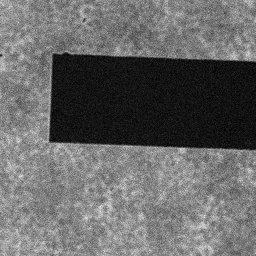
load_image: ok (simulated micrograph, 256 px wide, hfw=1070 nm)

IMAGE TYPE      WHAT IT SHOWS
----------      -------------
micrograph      one or a few lines or trenches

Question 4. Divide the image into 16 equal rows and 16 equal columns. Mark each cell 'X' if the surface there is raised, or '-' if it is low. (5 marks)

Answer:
XXXXXXXXXXXXXXXX
XXXXXXXXXXXXXXXX
XXXXXXXXXXXXXXXX
XXX-----XXXXXXXX
XXX-------------
XXX-------------
XXX-------------
XXX-------------
XXX-------------
XXXXXXXXXXXXXXXX
XXXXXXXXXXXXXXXX
XXXXXXXXXXXXXXXX
XXXXXXXXXXXXXXXX
XXXXXXXXXXXXXXXX
XXXXXXXXXXXXXXXX
XXXXXXXXXXXXXXXX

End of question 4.